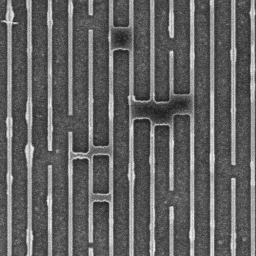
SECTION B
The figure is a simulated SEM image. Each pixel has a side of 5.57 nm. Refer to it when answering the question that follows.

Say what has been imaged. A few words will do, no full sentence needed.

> parallel lines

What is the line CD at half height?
20.9 nanometers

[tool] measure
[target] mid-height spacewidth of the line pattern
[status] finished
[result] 94.8 nanometers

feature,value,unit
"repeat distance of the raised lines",0.113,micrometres